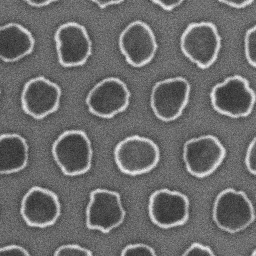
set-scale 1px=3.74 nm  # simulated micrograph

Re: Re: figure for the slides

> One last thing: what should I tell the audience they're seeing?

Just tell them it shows a regular array of raised bodies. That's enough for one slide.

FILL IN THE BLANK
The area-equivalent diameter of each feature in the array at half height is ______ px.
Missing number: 38.9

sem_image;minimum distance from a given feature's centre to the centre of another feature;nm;232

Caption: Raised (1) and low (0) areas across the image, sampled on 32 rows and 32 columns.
00001100000011000000110000000110
00000000000000000000000000000000
00000000000000000000000000000000
11100000110000001110000011100000
11110001111000011110000111100001
11110001111000011110000111100001
11110001111000011110000111100001
01000000111000001100000011100001
00000000000000000000000000000000
00000000000000000000000000000000
00011110000011100000111000001110
00011110000111110001111100011110
00011110000111110001111000011111
00011110000111100001111000011110
00001000000001000000110000000100
00000000000000000000000000000000
00000000000000000000000000000000
11100001111000001100000011100000
11100001111000011110000111110001
11100001111000011111000111110001
11100001111000011110000111100001
10000000110000001100000011000000
00000000000000000000000000000000
00000000000000000000000000000000
00011110000111100001111000011110
00011110000111100001111000011110
00011110000111100001111000011111
00011110000111100001111000011111
00000000000011000000000000001100
00000000000000000000000000000000
00000000000000000000000000000000
11100001111000011110000111000000